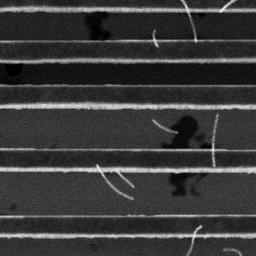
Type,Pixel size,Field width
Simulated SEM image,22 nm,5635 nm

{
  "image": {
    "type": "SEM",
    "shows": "lines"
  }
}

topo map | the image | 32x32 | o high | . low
oooooooooooooooooooooooooooooooo
.......................o........
................................
................................
................................
oooooooooooooooooooooooooooooooo
oooooooooooooooooooooooooooooooo
oooooooooooooooooooooooooooooooo
................................
................................
................................
oooooooooooooooooooooooooooooooo
oooooooooooooooooooooooooooooooo
................................
................................
................................
................................
................................
................................
oooooooooooooooooooooooooooooooo
oooooooooooooooooooooooooooooooo
............o.o.................
................................
................................
................................
................................
................................
oooooooooooooooooooooooooooooooo
oooooooooooooooooooooooooooooooo
oooooooooooooooooooooooooooooooo
................................
................................